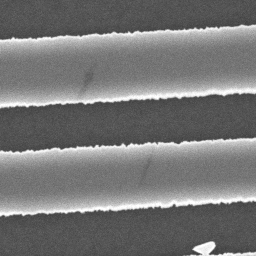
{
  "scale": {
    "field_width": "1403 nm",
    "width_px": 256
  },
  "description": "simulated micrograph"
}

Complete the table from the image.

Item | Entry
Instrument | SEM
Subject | lines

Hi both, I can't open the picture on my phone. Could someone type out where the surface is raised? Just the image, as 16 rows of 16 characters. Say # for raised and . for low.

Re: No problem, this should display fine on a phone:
................
................
################
################
################
################
####............
................
................
################
################
################
################
................
................
............#...